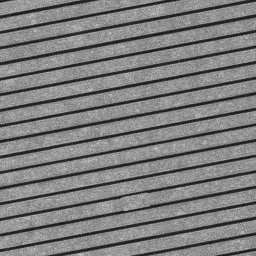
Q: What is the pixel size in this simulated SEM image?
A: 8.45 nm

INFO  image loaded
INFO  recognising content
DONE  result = parallel lines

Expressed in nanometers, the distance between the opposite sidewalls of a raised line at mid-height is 103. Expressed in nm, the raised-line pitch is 129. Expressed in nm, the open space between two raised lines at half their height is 29.1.